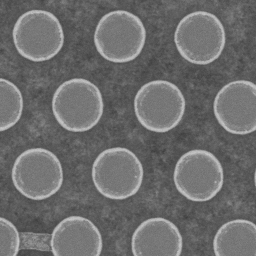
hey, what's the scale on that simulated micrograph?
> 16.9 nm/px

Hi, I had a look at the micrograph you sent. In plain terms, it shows a regular array of raised bodies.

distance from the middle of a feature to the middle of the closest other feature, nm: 1350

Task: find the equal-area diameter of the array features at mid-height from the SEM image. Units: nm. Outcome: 830